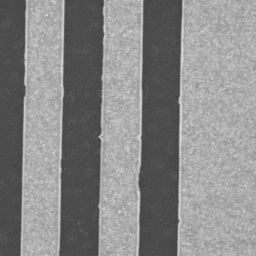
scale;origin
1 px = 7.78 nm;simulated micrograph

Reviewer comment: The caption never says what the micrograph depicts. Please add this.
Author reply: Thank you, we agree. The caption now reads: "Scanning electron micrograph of one or a few lines or trenches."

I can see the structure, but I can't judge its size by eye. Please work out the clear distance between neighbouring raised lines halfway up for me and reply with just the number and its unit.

39.7 pixels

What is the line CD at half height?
294 nanometres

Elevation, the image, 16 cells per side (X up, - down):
--XX---XX--XXXXX
--XX---XX--XXXXX
--XX--XXX--XXXXX
--XX--XXX--XXXXX
--XX--XXX--XXXXX
--XX--XXX--XXXXX
--XX--XXX--XXXXX
--XX--XXX--XXXXX
--XX--XXX--XXXXX
-XXX--XXX--XXXXX
-XXX--XXX--XXXXX
-XXX--XXX--XXXXX
-XXX--XXX--XXXXX
-XXX--XXX--XXXXX
-XXX--XXX--XXXXX
-XXX--XXX--XXXXX